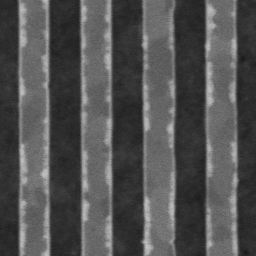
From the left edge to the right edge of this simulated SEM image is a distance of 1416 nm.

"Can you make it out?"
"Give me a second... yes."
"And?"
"one or a few lines or trenches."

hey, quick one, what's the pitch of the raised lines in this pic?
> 345 nm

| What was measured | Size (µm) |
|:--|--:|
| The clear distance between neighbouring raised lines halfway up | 0.186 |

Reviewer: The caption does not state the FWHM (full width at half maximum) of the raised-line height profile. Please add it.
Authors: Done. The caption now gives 28.9 pixels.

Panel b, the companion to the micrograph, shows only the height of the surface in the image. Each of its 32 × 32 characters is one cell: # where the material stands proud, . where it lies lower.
...###....####....####....###...
...###....####....####....###...
...###....####....####....###...
...###....####....####....###...
...###....####....####....###...
...###....####....####....###...
...###....####....####....###...
...###....####....####....###...
...###....####....####....###...
..####....####....####....###...
..####....####....####....###...
...###....####....####....###...
...###....####....####....###...
..####....####....####....###...
...###....####....####....###...
...###....####....####....###...
...###....####....####....###...
...###....####....####....###...
...###....####....####....###...
...###....####....####....###...
...###....####....####....###...
...###....####....####....####..
...###....####....####....####..
...###....####....####....###...
...###....####....####....###...
...###....####....####....###...
...###....####....####....###...
...###....####....####....###...
...###....####....####....###...
...###....####....####....###...
...###....####....####....###...
...###....####....####....###...